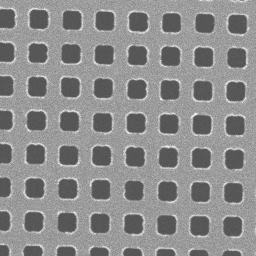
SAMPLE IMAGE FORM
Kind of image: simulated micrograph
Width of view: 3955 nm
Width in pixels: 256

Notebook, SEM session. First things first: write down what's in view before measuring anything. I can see a regular array of holes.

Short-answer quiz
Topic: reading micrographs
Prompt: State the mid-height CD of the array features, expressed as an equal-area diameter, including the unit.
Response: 323 nanometres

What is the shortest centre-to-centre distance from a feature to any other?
511 nm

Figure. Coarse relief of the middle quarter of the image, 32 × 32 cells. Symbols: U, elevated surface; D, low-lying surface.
UUUUUUUUUUUUUUUUUUUUUUUUUDDDUUUU
UUUUUUUUUUUUUUUUUUUUUUUUUUUUUUUU
UUUUUUUUUUUUUUUUUUUUUUUUUUUUUUUU
DDDUUUUUUUUUUUUUUUUUUUUUUUUUUUUU
DDDDUUUUDDDDUUUUDDDDUUUUDDDDUUUU
DDDDUUUDDDDDUUUUDDDDDUUUDDDDDUUU
DDDDUUUDDDDDUUUUDDDDDUUUDDDDDUUU
DDDDUUUDDDDDUUUUDDDDDUUUDDDDDUUU
UUDUUUUUUDDUUUUUDDDDUUUUDDDDDUUU
UUUUUUUUUUUUUUUUUUUUUUUUUUUUUUUU
UUUUUUUUUUUUUUUUUUUUUUUUUUUUUUUU
UUUUUUUUUUUUUUUUUUUUUUUUUUUUUUUU
DDDUUUUUDDDUUUUUDDDUUUUUUDUUUUUU
DDDDUUUDDDDDUUUUDDDDUUUUDDDDDUUU
DDDDUUUDDDDDUUUUDDDDUUUUDDDDDUUU
DDDDUUUDDDDDUUUUDDDDUUUUDDDDDUUU
DDDUUUUUDDDDUUUUDDDDUUUUDDDDDUUU
UUUUUUUUUUUUUUUUUUUUUUUUUDDDUUUU
UUUUUUUUUUUUUUUUUUUUUUUUUUUUUUUU
UUUUUUUUUUUUUUUUUUUUUUUUUUUUUUUU
DDDUUUUUUUUUUUUUUUUUUUUUUUUUUUUU
DDDDUUUDDDDDUUUUDDDDUUUUDDDDUUUU
DDDUUUUDDDDDUUUDDDDDUUUUDDDDDUUU
DDDDUUUDDDDDUUUDDDDDUUUUDDDDUUUU
DDDUUUUDDDDDUUUUDDDDUUUUDDDDDUUU
UUUUUUUUDDDUUUUUDDDDUUUUDDDDUUUU
UUUUUUUUUUUUUUUUUUUUUUUUUUUUUUUU
UUUUUUUUUUUUUUUUUUUUUUUUUUUUUUUU
UUUUUUUUUUUUUUUUUUUUUUUUUUUUUUUU
DDDUUUUDDDDUUUUUDDDUUUUUDDDDUUUU
DDDDUUUDDDDDUUUDDDDDUUUUDDDDUUUU
DDDUUUUDDDDDUUUDDDDDUUUDDDDDUUUU